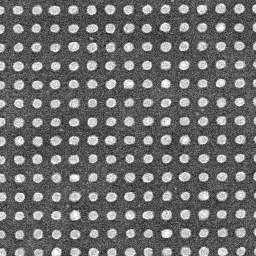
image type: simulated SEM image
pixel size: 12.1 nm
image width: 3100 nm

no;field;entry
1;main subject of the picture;a regular array of raised bodies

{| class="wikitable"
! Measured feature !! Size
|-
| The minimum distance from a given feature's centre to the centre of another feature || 218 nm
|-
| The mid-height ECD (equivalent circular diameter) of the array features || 8.96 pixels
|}